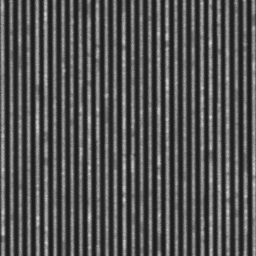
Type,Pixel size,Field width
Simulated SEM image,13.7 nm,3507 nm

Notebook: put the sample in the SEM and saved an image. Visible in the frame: parallel lines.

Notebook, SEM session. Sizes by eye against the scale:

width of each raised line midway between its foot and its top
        51.4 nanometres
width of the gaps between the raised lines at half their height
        65.1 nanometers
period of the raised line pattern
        119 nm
